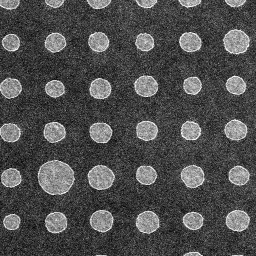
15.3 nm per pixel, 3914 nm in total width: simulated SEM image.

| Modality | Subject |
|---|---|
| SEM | a regular array of raised bodies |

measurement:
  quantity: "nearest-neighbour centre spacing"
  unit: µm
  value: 0.673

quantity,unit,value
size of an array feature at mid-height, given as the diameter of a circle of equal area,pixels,20.4